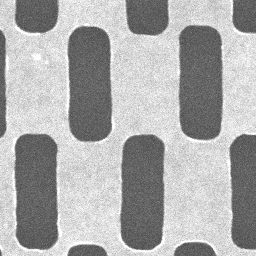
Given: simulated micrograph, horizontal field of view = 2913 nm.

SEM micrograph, holes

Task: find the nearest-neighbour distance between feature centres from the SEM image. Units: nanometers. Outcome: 1240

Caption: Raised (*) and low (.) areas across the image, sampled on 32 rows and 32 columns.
**.....*********.....********...
**.....*********.....********...
**.....*********.....********...
**.....***...***.....**....**...
.********.....********......****
.*******......********......****
.*******......********......****
.*******......********......****
.*******......********......****
.*******......********......****
.********.....********......****
.********.....********......****
.********.....********......****
.********.....********......****
.********.....********......****
.********.....*********.....****
.********.....*********.....****
**.....***...***....*****.***...
**.....********......********...
**.....********......********...
**.....********......********...
**.....********.....*********...
**.....********.....*********...
**.....********......********...
**.....********......********...
**.....********......********...
**.....********......********...
**.....********......********...
**.....********.....*********...
**.....********.....*********...
**.....*********....***...***...
********.....*********.....*****